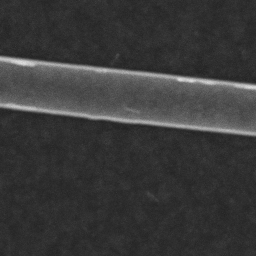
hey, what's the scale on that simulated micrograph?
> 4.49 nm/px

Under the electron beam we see one or a few lines or trenches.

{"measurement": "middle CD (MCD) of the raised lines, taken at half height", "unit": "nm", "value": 223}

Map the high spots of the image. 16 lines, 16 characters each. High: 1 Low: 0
0000000000000000
0000000000000000
0000000000000000
0000000000000000
1111111100000000
1111111111111111
1111111111111111
0000000111111111
0000000000000000
0000000000000000
0000000000000000
0000000000000000
0000000000000000
0000000000000000
0000000000000000
0000000000000000